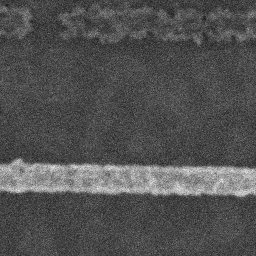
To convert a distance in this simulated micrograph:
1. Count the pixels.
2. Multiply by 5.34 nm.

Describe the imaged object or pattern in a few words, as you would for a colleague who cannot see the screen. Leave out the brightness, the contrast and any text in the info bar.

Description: one or a few lines or trenches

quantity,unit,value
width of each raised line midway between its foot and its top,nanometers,120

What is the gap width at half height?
710 nm